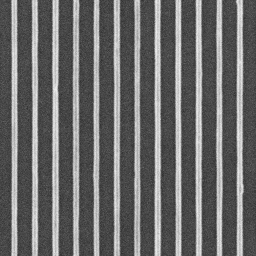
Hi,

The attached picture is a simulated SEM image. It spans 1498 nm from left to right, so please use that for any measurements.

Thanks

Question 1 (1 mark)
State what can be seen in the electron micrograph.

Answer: parallel lines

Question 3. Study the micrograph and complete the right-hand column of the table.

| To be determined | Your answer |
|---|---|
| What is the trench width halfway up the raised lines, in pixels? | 16.4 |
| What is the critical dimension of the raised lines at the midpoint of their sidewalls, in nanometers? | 26.3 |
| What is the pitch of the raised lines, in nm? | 120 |